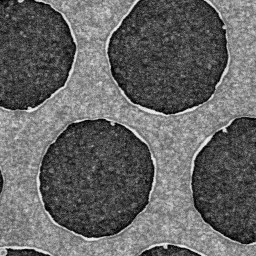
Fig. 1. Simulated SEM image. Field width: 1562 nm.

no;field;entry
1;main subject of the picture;holes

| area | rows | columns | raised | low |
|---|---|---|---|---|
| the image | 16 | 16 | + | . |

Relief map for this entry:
...+++++.....+++
....+++.......++
.....++.......++
.....++.......++
....+++.......++
....+++.......++
...+++++.....+++
+++++..++++++++.
++++.....++++...
+++......+++....
+++.......++....
++........++....
+++......+++....
+++......++++...
+++++..+++++++..
.++++++++...++++